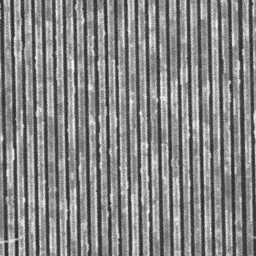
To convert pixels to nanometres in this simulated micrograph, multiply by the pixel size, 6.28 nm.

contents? parallel lines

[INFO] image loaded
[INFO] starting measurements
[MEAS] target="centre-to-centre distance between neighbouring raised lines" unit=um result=0.065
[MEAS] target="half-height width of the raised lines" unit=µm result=0.0377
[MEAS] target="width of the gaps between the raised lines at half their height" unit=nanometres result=25.1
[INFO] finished